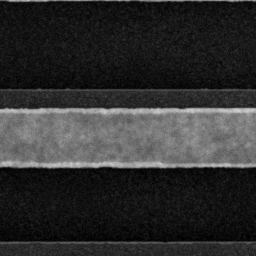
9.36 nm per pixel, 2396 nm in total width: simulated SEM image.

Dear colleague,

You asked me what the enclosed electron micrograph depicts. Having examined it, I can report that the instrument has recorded lines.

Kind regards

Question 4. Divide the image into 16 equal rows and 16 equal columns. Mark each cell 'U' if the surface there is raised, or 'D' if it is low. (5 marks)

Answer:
DDDDDDDDDDDDDDDD
DDDDDDDDDDDDDDDD
DDDDDDDDDDDDDDDD
DDDDDDDDDDDDDDDD
DDDDDDDDDDDDDDDD
DDDDDDDDDDDDDDDD
UUUUUUUUUUUUUUUU
UUUUUUUUUUUUUUUU
UUUUUUUUUUUUUUUU
UUUUUUUUUUUUUUUU
DDDDDDDDDDDDDDDD
DDDDDDDDDDDDDDDD
DDDDDDDDDDDDDDDD
DDDDDDDDDDDDDDDD
DDDDDDDDDDDDDDDD
UUUUUUUUUUUUUUUU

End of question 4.